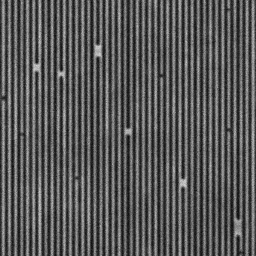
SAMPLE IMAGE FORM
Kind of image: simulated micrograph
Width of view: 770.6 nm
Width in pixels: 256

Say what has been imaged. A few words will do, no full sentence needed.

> parallel lines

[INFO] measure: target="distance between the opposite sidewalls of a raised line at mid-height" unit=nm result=5.3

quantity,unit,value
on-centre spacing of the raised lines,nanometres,18.3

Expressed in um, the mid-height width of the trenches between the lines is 0.0135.